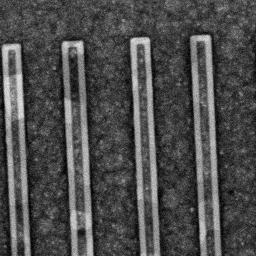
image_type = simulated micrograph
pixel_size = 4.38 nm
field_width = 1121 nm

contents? one or a few lines or trenches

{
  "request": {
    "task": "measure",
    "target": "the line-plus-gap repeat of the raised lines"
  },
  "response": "277 nanometres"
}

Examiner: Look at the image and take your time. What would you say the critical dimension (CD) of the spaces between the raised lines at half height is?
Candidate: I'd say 46.7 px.